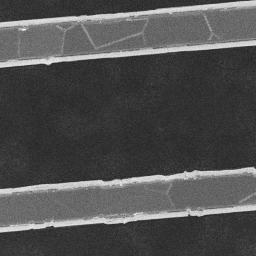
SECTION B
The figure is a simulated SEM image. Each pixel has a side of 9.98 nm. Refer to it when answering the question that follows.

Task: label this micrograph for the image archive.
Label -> one or a few lines or trenches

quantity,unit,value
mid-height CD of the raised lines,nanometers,391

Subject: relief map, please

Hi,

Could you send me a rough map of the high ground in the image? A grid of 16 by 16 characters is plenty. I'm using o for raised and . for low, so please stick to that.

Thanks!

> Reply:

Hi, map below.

............oooo
.ooooooooooooooo
oooooooooooooooo
ooooooo.........
................
................
................
................
................
................
................
.....ooooooooooo
oooooooooooooooo
oooooooooo......
................
................